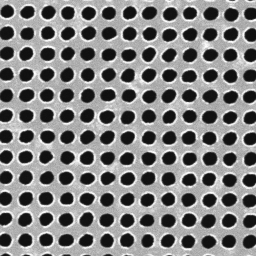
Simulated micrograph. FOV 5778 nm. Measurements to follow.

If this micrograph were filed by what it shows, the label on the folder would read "a regular array of holes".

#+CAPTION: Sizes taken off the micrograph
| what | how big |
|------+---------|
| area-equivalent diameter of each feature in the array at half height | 0.324 micrometres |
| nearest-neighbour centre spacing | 451 nanometres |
